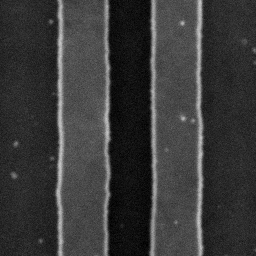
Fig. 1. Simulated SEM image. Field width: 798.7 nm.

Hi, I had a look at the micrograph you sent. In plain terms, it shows lines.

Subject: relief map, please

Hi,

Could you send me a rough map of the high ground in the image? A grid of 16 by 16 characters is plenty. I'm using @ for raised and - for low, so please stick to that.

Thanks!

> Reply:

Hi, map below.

----@@@--@@@@---
----@@@--@@@@---
----@@@---@@@---
----@@@--@@@@---
----@@@--@@@----
----@@@--@@@@---
----@@@--@@@----
----@@@---@@@---
----@@@---@@@---
----@@@---@@@---
----@@@---@@@---
----@@@---@@@---
----@@@---@@@---
----@@@--@@@@---
----@@@--@@@@---
----@@@--@@@@---